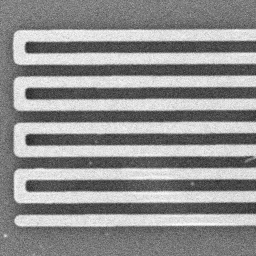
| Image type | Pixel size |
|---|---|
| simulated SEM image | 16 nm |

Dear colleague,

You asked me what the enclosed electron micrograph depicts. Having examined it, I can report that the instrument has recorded groups of lines, slits or small figures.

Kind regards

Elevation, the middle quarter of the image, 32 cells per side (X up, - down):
--------------------------------
--------------------------------
--------------------------------
XXXXXXXXXXXXXXXXXXXXXXXXXXXXXXXX
XXXXXXXXXXXXXXXXXXXXXXXXXXXXXXXX
XXXXXXXXXXXXXXXXXXXXXXXXXXXXXXXX
--------------------------------
--------------------------------
--------------------------------
XXXXXXXXXXXXXXXXXXXXXXXXXXXXXXXX
XXXXXXXXXXXXXXXXXXXXXXXXXXXXXXXX
--------------------------------
--------------------------------
--------------------------------
--------------------------------
XXXXXXXXXXXXXXXXXXXXXXXXXXXXXXXX
XXXXXXXXXXXXXXXXXXXXXXXXXXXXXXXX
--------------------------------
--------------------------------
--------------------------------
------------------------XXXXXXXX
XXXXXXXXXXXXXXXXXXXXXXXXXXXXXXXX
XXXXXXXXXXXXXXXXXXXXXXXXXXXXXXXX
--------------------------------
--------------------------------
--------------------------------
XXXXXXXXXXXXXXXXXX-------XXXXXXX
XXXXXXXXXXXXXXXXXXXXXXXXXXXXXXXX
XXXXXXXXXXXXXXXXXX---------XXXXX
--------------------------------
--------------------------------
--------------------------------